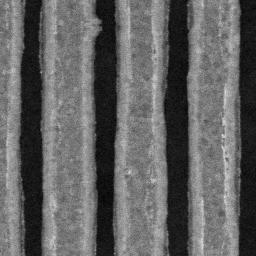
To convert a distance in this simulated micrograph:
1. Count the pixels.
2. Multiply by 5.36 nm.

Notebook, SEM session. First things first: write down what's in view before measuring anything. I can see one or a few lines or trenches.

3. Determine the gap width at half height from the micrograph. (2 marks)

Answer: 177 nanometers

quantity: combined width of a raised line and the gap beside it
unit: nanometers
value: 388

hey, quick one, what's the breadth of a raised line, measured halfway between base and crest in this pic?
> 0.21 µm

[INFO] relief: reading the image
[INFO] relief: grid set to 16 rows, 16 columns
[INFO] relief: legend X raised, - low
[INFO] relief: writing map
X--XXX--XX--XXX-
X--XXX--XX--XXX-
X--XXX--XX--XXX-
X--XX---XX--XXX-
X--XX---XX--XXX-
X--XX---XX--XX--
X--XX---XX--XX--
X--XX---XX--XX--
X--XX---XX--XX--
X--XXX-XXX--XX--
X--XXX-XXX--XXX-
X--XXX-XXX--XX--
X--XXX--XX--XX--
X--XXX--XX--XXX-
X--XXX--XX--XXX-
X--XXX--XX--XXX-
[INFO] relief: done